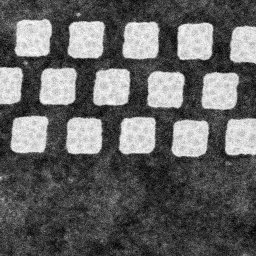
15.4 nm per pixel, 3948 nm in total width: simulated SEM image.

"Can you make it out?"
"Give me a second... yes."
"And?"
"a regular array of raised bodies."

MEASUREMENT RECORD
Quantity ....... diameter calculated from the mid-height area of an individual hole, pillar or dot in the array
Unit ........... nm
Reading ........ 591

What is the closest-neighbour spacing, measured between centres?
829 nanometres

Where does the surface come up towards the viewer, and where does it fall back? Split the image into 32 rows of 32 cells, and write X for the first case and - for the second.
--------------------------------
--------------------------------
--------------------------------
--XXXX---XXXX---XXXX--XXXXX---XX
--XXXX---XXXX---XXXX--XXXX---XXX
--XXXX---XXXX---XXXX--XXXX---XXX
--XXXX---XXXX---XXXX--XXXX---XXX
-----------------------------XXX
--------------------------------
XXX--XXXX---XXXX---XXXX---XXXX--
XXX--XXXX---XXXX---XXXX--XXXXX--
XX---XXXX---XXXX---XXXX--XXXXX--
XX---XXXX---XXXX---XXXX--XXXX---
--------------------------XX----
--------------------------------
--XXXX---XXXX--XXXX---XXXX---XXX
--XXXX--XXXXX--XXXX---XXXX--XXXX
--XXXX--XXXXX--XXXX---XXXX--XXXX
--XXXX--XXXXX--XXXX---XXXX--XXXX
----------------------X---------
--------------------------------
--------------------------------
--------------------------------
--------------------------------
--------------------------------
--------------------------------
--------------------------------
--------------------------------
--------------------------------
--------------------------------
--------------------------------
--------------------------------